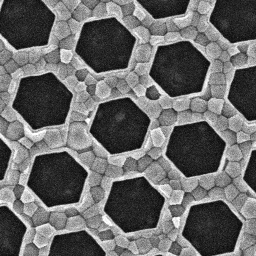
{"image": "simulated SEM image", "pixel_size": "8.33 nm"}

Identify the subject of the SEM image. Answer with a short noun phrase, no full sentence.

holes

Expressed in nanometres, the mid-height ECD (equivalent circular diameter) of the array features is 472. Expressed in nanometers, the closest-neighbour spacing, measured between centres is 657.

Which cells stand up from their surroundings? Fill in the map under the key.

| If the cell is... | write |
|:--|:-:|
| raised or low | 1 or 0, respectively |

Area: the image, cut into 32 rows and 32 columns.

00000011111111111000000011100000
00000001111111111110000111000000
00000001111100011111111111000000
00000001110000001111111111100000
00000011110000000111111111110000
10000011110000000111100011111111
11111111100000000110000001111111
11111111110000001110000000111111
11111111111000001110000000111110
11110001111111111110000000111000
11000000111111111111000001111000
11000000011111111111100001111000
11000000011111000111111111111000
11000000011100000011111111111000
11100000111100000001111111111100
11100000111000000001111000111111
11111111111000000011100000011111
11111111111100000011100000001111
01111111111110000111100000001111
01111000011111111111100000001110
01110000001111111111110000001110
01110000000111111111111000011110
11100000000111100011111111111110
11110000001111000001111111111110
11111000001111000000111111111111
11111100011110000000011110001111
00111111111110000000111100000111
00011111111111000000111000000011
00011111111111100001111000000011
00011110000111111111111000000011
00011100000011111111111100000011
00011100000001111111111110000111